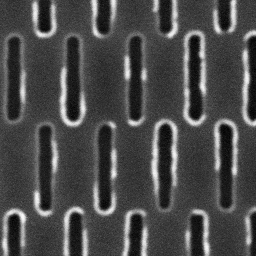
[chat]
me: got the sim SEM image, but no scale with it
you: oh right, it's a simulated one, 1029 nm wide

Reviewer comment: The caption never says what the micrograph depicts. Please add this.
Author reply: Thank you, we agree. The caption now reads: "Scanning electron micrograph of a regular array of holes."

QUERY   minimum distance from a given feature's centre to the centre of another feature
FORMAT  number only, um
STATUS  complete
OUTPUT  0.238